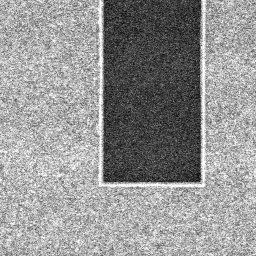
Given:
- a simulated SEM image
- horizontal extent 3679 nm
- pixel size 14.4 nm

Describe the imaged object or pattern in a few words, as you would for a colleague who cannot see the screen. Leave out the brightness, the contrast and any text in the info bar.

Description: one or a few lines or trenches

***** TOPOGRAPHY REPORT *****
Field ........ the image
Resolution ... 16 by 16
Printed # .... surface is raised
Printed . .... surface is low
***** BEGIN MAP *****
######.......###
######.......###
######.......###
######.......###
######.......###
######.......###
######.......###
######.......###
######.......###
######.......###
######.......###
#######.....####
################
################
################
################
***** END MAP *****